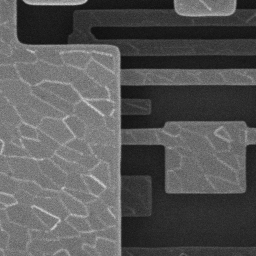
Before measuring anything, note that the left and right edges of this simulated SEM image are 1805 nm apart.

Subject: wiring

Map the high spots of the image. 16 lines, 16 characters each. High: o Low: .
o..........oooo.
o...............
o...............
ooooooo.........
ooooooo.........
ooooooo.........
oooooooo........
oooooooo........
oooooooo........
oooooooo........
oooooooo........
oooooooo........
oooooooo........
oooooooo........
oooooooo........
oooooooo........